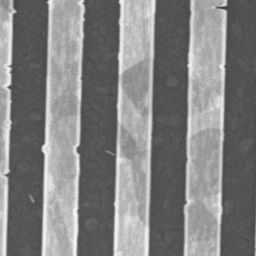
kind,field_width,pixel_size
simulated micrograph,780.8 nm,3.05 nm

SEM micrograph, one or a few lines or trenches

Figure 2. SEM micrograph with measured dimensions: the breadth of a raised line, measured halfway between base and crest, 98.6 nm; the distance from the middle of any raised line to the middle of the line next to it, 0.217 um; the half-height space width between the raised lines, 0.118 um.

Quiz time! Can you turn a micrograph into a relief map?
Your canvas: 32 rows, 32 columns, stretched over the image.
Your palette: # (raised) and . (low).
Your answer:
#.....####.....####.....####....
##....####.....####.....####....
#.....####.....####.....####....
#.....####.....####.....####....
#.....####.....####.....####....
#.....####.....####.....####....
#.....####.....####.....####....
#.....####.....####.....####....
#.....####.....####.....####....
#.....####.....####.....####....
#.....####.....####.....####....
#.....####.....####.....####....
#.....####.....####.....####....
#.....####.....####.....####....
#.....####.....####.....####....
#.....####.....####.....####....
#.....####.....####.....####....
#.....####.....####.....####....
#.....####.....####.....####....
#.....####.....####.....####....
#.....####.....####.....####....
#.....####.....###.....#####....
#.....####.....###.....####.....
#.....####.....####.....###.....
#.....####.....####....#####....
#.....####.....###.....#####....
#.....####.....###.....####.....
#.....####.....###.....####.....
#.....####....####.....####.....
#.....###.....####.....####.....
#.....###.....####.....####.....
#....####.....####.....####.....